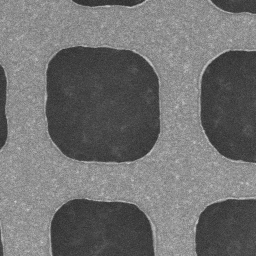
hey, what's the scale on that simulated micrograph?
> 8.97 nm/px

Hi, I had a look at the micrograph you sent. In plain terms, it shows holes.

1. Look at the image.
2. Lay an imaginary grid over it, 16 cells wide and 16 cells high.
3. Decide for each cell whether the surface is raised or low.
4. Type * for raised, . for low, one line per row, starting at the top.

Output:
**************..
****************
****************
***......*****..
***.......***...
***.......***...
***.......***...
***.......***...
***.......***...
****.....*****..
****************
****************
*****.********..
***......****...
***.......**....
***.......**....